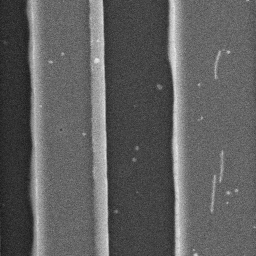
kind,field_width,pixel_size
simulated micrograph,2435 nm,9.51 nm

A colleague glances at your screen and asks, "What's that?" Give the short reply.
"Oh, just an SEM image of lines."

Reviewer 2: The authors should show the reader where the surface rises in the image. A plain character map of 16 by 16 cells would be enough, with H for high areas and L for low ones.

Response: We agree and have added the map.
LLHHHHLLLLLHHHHH
LLHHHHLLLLLHHHHH
LLHHHHLLLLLHHHHH
LLHHHHLLLLLHHHHH
LLHHHHLLLLLHHHHH
LLHHHHLLLLLHHHHH
LLHHHHLLLLLHHHHH
LLHHHHHLLLLHHHHH
LLHHHHHLLLLHHHHH
LLHHHHHLLLLHHHHH
LLHHHHHLLLLHHHHH
LLHHHHHLLLLHHHHH
LLHHHHHLLLLHHHHH
LLHHHHHLLLLHHHHH
LLHHHHHLLLLHHHHH
LLHHHHHLLLLHHHHH